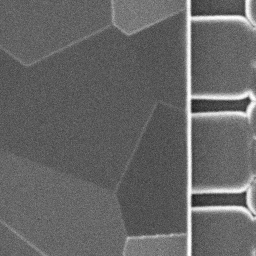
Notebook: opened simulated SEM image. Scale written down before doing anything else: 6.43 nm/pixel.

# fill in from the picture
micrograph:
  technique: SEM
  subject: wiring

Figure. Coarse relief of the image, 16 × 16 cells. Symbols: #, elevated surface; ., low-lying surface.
############....
############....
############....
############....
############....
############....
############....
############....
############....
############....
############....
############....
############....
############....
############....
############....